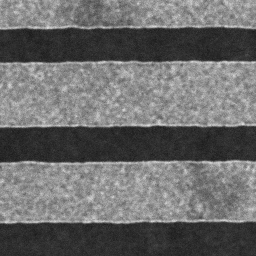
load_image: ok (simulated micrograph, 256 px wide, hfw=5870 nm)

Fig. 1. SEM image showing wiring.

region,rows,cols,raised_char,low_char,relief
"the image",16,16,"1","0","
1111111111111111
1111111111111111
0000000000000000
0000000000000000
1111111111111111
1111111111111111
1111111111111111
1111111111111111
0000000000000000
0000000000000000
1111111111111111
1111111111111111
1111111111111111
1111111111111111
0000000000000000
0000000000000000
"